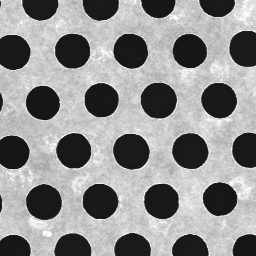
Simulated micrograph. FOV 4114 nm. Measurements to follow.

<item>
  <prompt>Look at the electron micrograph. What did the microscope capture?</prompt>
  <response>a regular array of holes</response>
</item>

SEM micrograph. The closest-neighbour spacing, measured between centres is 915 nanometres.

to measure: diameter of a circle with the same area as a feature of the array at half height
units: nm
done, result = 572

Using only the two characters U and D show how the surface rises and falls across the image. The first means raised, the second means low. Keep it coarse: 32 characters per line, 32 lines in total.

UUUDDDDUUUDDDDDUUUDDDDUUUDDDDUUU
UUUDDDDUUUUDDDDUUUDDDUUUUUDDDUUU
UUUUUDUUUUUUDUUUUUUUUUUUUUUUUUUU
UUUUUUUUUUUUUUUUUUUUUUUUUUUUUUUU
UDUUUUUUDDUUUUUDDUUUUUUDDUUUUDDD
DDDDUUUDDDDUUUDDDDUUUUDDDDUUUDDD
DDDDUUUDDDDUUUDDDDUUUUDDDDUUUDDD
DDDDUUUDDDDUUUUDDDUUUUDDDDUUUDDD
UDDUUUUUDDUUUUUUDUUUUUUUUUUUUUUU
UUUUUUUUUUUUUUUUUUUUUUUUUUUUUUUU
UUUUUUUUUUUUDUUUUUUDDUUUUUUDUUUU
UUUUDDDUUUUDDDDUUUDDDDUUUDDDDUUU
UUUDDDDUUUUDDDDUUUDDDDUUUDDDDDUU
UUUDDDDUUUUDDDDUUUDDDDUUUDDDDUUU
UUUUDDDUUUUUDDUUUUUDDUUUUUDDDUUU
UUUUUUUUUUUUUUUUUUUUUUUUUUUUUUUU
UUUUUUUUUUUUUUUUUUUUUUUUUUUUUUUU
DDDUUUUUDDDUUUUDDDUUUUDDDUUUUDDD
DDDDUUUDDDDUUUDDDDDUUUDDDDUUUDDD
DDDDUUUDDDDUUUDDDDDUUUDDDDUUUDDD
DDDUUUUUDDDUUUUDDDUUUUDDDUUUUUDD
UUUUUUUUUUUUUUUUUUUUUUUUUUUUUUUU
UUUUUUUUUUUUUUUUUUUUUUUUUUUUUUUU
UUUUDDDUUUUDDDUUUUUDDDUUUUDDDUUU
UUUDDDDDUUDDDDDUUUDDDDUUUDDDDDUU
UUUDDDDDUUDDDDDUUUDDDDUUUDDDDDUU
UUUUDDDUUUUDDDUUUUDDDDUUUUDDDUUU
UUUUUDUUUUUUUUUUUUUUUUUUUUUUUUUU
UUUUUUUUUUUUUUUUUUUUUUUUUUUUUUUU
UDUUUUUUDDUUUUUDDDUUUUUDDUUUUUDD
DDDDUUUDDDDUUUDDDDDUUUDDDDUUUDDD
DDDDUUUDDDDUUUDDDDDUUUDDDDUUUDDD